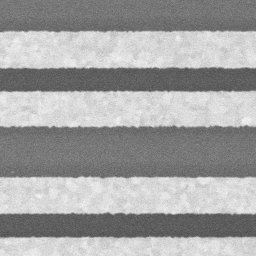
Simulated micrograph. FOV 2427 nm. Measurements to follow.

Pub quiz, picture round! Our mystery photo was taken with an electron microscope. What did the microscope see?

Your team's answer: lines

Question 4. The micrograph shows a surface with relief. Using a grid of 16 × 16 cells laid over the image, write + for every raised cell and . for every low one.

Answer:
................
................
++++++++++++++++
++++++++++++++++
................
................
++++++++++++++++
++++++++++++++++
................
................
................
++++++++++++++++
++++++++++++++++
................
................
++++++++++++++++